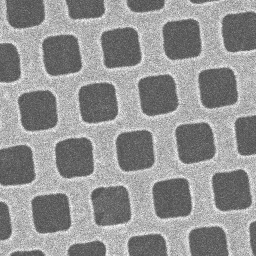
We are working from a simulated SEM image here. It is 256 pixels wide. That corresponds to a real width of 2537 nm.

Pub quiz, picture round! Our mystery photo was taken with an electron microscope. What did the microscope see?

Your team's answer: a regular array of holes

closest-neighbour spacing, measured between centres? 0.592 micrometres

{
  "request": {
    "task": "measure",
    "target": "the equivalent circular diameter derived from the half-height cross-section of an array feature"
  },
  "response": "422 nanometers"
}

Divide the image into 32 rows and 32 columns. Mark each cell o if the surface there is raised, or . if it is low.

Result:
o.....oo.....ooo.....ooo.ooooooo
o.....ooo....oooo..oooooooooooo.
o.....oooooooooooooooo..oooo....
oo.oooooooooooo..ooo.....ooo....
ooooooo..oooo....ooo.....ooo....
..ooo.....ooo....ooo.....ooo....
..ooo.....ooo.....ooo....oooo.oo
...oo.....ooo.....ooo..ooooooooo
...ooo....ooo..oooooooooooo..ooo
...oooooooooooooooo..oooo....ooo
ooooooooooo...ooo.....ooo.....oo
oooo..oooo.....oo.....ooo.....oo
oo.....ooo.....oo.....ooo.....oo
oo.....ooo.....ooo....oooo.ooooo
ooo....ooo.....oooooooooooooooo.
ooo....oooooooooooooooo...ooo...
oooooooooooooooo...ooo.....oo...
oooooooo...ooo.....ooo.....ooo..
o...ooo.....oo.....ooo.....ooo..
....ooo.....ooo....ooo.....ooooo
....ooo.....ooo....oooo.oooooooo
....ooo.....oooooooooooooooo...o
....ooooooooooooooooo..ooo.....o
oooooooooooo....ooo.....ooo....o
ooooo...ooo.....ooo.....ooo....o
.ooo.....oo.....ooo.....ooo....o
.ooo.....ooo....ooo.....oooooooo
.ooo.....ooo....oooooooooooooooo
..oo.....oooooooooooooooo...ooo.
.oooooooooooooooo...oooo....ooo.
ooooooooo....ooo.....ooo....ooo.
oo...ooo.....ooo.....ooo.....oo.